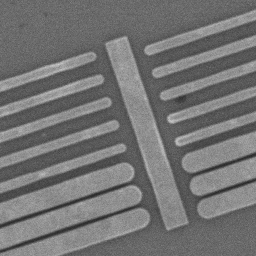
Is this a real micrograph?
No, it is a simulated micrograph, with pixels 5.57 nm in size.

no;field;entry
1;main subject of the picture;groups of lines, slits or small figures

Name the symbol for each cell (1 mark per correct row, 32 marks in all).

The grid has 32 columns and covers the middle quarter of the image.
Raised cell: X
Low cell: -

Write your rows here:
XXXX--------XXXXXX-------XXXXXXX
-------------XXXXX----XXXXXXX---
-------------XXXXXX---XXXX------
------XXXX---XXXXXX-------------
---XXXXXXX----XXXXX-------------
-XXXXXX-------XXXXXX---------XXX
XXXXX---------XXXXXX------XXXXXX
X--------------XXXXX----XXXXXX--
----------X----XXXXXX---XXX-----
--------XXXX---XXXXXX-----------
----XXXXXXX----XXXXXX-----------
-XXXXXXX--------XXXXXX--------XX
XXXXX-----------XXXXXX------XXXX
XX---------------XXXXX----XXXXX-
-----------XX----XXXXXX---------
---------XXXXX---XXXXXX---------
------XXXXXXX-----XXXXX---------
--XXXXXXX---------XXXXX---------
XXXXXX------------XXXXXX-----XXX
XXX----------------XXXXX----XXXX
-------------XX----XXXXXX-------
----------XXXXX----XXXXXX-------
-------XXXXXX-------XXXXX------X
----XXXXXX----------XXXXXX----XX
XXXXXXX-------------XXXXXX----XX
XXXX---------XXXX----XXXXX----XX
X--------XXXXXXXX----XXXXXX---XX
------XXXXXXXXXXX----XXXXXX-----
---XXXXXXXXXXXXXX-----XXXXX-----
XXXXXXXXXXXXXXXX------XXXXXX----
XXXXXXXXXXXX----------XXXXXX----
XXXXXXXXXX---XXXXXX----XXXXX----